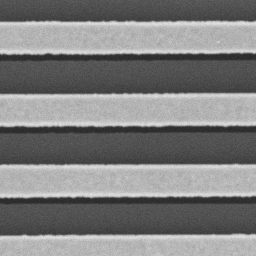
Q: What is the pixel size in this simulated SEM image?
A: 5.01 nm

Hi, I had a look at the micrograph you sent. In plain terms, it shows lines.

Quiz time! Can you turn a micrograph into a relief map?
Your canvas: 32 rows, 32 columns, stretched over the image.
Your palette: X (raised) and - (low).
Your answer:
--------------------------------
--------------------------------
--------------------------------
XXXXXXXXXXXXXXXXXXXXXXXXXXXXXXXX
XXXXXXXXXXXXXXXXXXXXXXXXXXXXXXXX
XXXXXXXXXXXXXXXXXXXXXXXXXXXXXXXX
XXXXXXXXXXXXXXXXXXXXXXXXXXXXXXXX
--------------------------------
--------------------------------
--------------------------------
--------------------------------
--------------------------------
XXXXXXXXXXXXXXXXXXXXXXXXXXXXXXXX
XXXXXXXXXXXXXXXXXXXXXXXXXXXXXXXX
XXXXXXXXXXXXXXXXXXXXXXXXXXXXXXXX
XXXXXXXXXXXXXXXXXXXXXXXXXXXXXXXX
--------------------------------
--------------------------------
--------------------------------
--------------------------------
--------------------------------
XXXXXXXXXXXXXXXXXXXXXXXXXXXXXXXX
XXXXXXXXXXXXXXXXXXXXXXXXXXXXXXXX
XXXXXXXXXXXXXXXXXXXXXXXXXXXXXXXX
XXXXXXXXXXXXXXXXXXXXXXXXXXX-X---
--------------------------------
--------------------------------
--------------------------------
--------------------------------
---X-XX-XXXXXXXXXXXXXXXXXXXXXXXX
XXXXXXXXXXXXXXXXXXXXXXXXXXXXXXXX
XXXXXXXXXXXXXXXXXXXXXXXXXXXXXXXX